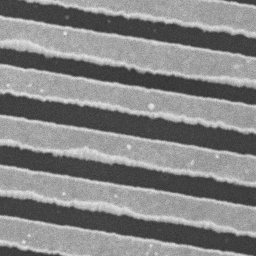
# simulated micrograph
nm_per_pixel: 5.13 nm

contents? lines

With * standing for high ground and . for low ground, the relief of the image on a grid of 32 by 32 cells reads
.......***********************..
.............*******************
***.................************
*********................*******
****************................
**********************..........
......**********************....
...........*********************
**...............***************
*********..............*********
***************................*
*********************...........
.......*********************....
..............******************
*...................************
*******...................******
*************...................
*******************.............
....*********************.......
............********************
.................***************
******................**********
***********.................****
*****************...............
....*******************.........
........*********************...
...............*****************
****.................***********
**********.................*****
****************................
.*********************..........
.....***********************....